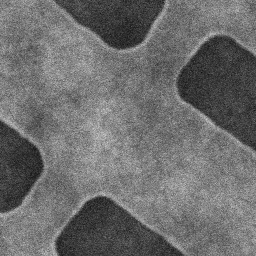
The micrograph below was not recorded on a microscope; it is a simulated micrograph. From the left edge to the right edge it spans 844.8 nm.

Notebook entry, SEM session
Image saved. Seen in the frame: holes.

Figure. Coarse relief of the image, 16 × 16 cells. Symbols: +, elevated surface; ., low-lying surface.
++++......++++++
+++++.....++++++
++++++...++++..+
++++++++++++....
+++++++++++.....
+++++++++++.....
++++++++++++....
+++++++++++++...
.++++++++++++++.
..++++++++++++++
...+++++++++++++
..++++++++++++++
.+++++.+++++++++
+++++...++++++++
++++......++++++
+++........+++++